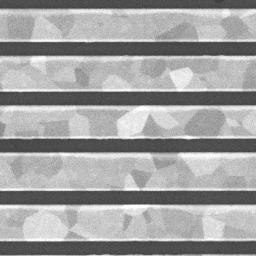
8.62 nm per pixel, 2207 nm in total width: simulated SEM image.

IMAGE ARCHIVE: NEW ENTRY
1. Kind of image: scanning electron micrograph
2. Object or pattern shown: lines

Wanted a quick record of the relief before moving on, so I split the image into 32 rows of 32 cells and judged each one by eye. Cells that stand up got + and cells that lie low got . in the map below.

................................
++++++++++++++++++++++++++++++++
++++++++++++++++++++++++++++++++
++++++++++++++++++++++++++++++++
++++++++++++++++++++++++++++++++
................................
................................
++++++++++++++++++++++++++++++++
++++++++++++++++++++++++++++++++
++++++++++++++++++++++++++++++++
++++++++++++++++++++++++++++++++
................................
................................
++++++++++++++++++++++++++++++++
++++++++++++++++++++++++++++++++
++++++++++++++++++++++++++++++++
++++++++++++++++++++++++++++++++
................................
................................
++++++++++++++++++++++++++++++++
++++++++++++++++++++++++++++++++
++++++++++++++++++++++++++++++++
++++++++++++++++++++++++++++++++
++++++++++++++++++++++++++++++++
................................
................................
++++++++++++++++++++++++++++++++
++++++++++++++++++++++++++++++++
++++++++++++++++++++++++++++++++
++++++++++++++++++++++++++++++++
................................
................................